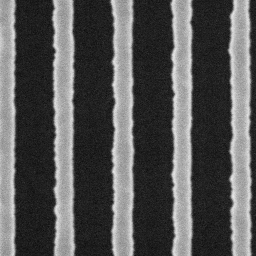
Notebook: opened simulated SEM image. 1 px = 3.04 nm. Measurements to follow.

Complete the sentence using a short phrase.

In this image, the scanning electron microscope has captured lines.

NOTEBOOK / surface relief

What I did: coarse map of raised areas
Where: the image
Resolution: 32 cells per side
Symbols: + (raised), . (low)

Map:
++.....++.....+++....+++.....++.
++.....++.....+++.....++.....++.
++.....++.....+++.....++.....++.
++.....++.....++......++.....++.
++.....++.....++......++.....++.
++.....++.....++......++.....++.
++.....++.....++......++.....++.
++.....++.....++......++.....++.
++.....++.....++......++.....++.
++.....++.....+++.....++.....++.
++.....++.....+++.....++.....++.
++.....++.....++......++.....++.
++.....++.....+++.....++.....++.
++.....++.....+++.....++.....++.
++.....++.....++......++.....++.
++.....++.....+++.....++.....++.
++.....++.....++......++.....++.
++.....++.....+++.....++.....++.
++.....++.....+++.....++.....++.
++.....++.....+++.....++.....++.
++.....++.....+++.....++.....++.
++.....++.....++......++.....++.
++.....++.....+++.....++.....++.
++.....++.....+++.....++.....++.
++.....++.....+++.....++.....++.
++.....++.....+++.....++.....++.
++.....++.....++......++.....++.
++.....++.....++......++.....++.
++.....++.....++......++.....++.
++.....++.....+++.....++.....++.
++.....++.....+++.....++.....++.
++.....++.....+++.....++.....++.